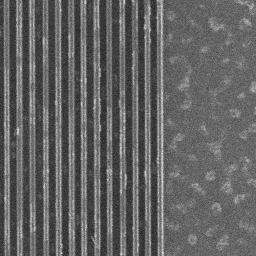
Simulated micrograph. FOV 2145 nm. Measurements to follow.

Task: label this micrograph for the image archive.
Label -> parallel lines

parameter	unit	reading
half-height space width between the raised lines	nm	63.9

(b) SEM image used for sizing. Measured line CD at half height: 0.0398 um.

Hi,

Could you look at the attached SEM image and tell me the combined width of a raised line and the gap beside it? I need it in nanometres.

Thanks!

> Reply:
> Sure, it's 107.